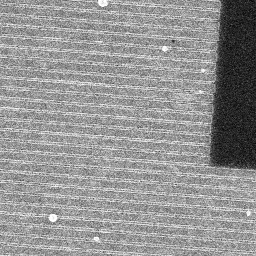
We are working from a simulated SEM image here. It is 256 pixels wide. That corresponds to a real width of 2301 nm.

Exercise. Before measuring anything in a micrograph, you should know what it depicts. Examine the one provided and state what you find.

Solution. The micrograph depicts parallel lines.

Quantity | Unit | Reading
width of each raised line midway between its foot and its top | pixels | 2.74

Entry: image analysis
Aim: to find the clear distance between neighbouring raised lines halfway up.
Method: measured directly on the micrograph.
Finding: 66.1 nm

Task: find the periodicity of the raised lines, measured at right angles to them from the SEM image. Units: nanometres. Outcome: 93.5